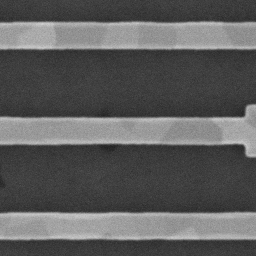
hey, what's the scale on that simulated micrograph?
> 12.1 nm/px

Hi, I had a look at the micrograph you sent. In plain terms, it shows wiring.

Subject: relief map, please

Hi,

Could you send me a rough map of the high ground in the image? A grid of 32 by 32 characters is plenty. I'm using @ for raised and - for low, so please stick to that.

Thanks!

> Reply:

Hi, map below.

--------------------------------
--------------------------------
--------------------------------
@@@@@@@@@@@@@@@@@@@@@@@@@@@@@@@@
@@@@@@@@@@@@@@@@@@@@@@@@@@@@@@@@
@@@@@@@@@@@@@@@@@@@@@@@@@@@@@@@@
--------------------------------
--------------------------------
--------------------------------
--------------------------------
--------------------------------
--------------------------------
--------------------------------
-------------------------------@
------------------------------@@
@@@@@@@@@@@@@@@@@@@@@@@@@@@@@@@@
@@@@@@@@@@@@@@@@@@@@@@@@@@@@@@@@
@@@@@@@@@@@@@@@@@@@@@@@@@@@@@@@@
-------------------------------@
-------------------------------@
--------------------------------
--------------------------------
--------------------------------
--------------------------------
--------------------------------
--------------------------------
--------------------------------
@@@@@@@@@@@@@@@@@@@@@@@@@@@@@@@@
@@@@@@@@@@@@@@@@@@@@@@@@@@@@@@@@
@@@@@@@@@@@@@@@@@@@@@@@@@@@@@@@@
--------------------------------
--------------------------------